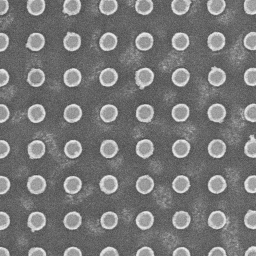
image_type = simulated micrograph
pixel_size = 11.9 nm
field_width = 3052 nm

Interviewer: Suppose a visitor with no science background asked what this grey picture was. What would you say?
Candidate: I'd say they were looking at a regular array of raised bodies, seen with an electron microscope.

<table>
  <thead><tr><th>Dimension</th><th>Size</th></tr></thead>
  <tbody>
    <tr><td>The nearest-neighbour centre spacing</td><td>423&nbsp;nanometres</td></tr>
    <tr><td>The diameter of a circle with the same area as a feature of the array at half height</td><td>0.201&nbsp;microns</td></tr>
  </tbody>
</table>